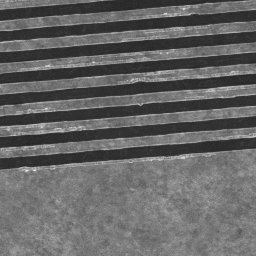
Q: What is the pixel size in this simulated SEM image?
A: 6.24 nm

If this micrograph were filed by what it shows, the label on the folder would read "parallel lines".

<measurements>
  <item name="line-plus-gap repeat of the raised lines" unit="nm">132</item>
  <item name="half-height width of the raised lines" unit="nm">59.8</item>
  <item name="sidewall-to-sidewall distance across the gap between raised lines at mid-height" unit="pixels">11.6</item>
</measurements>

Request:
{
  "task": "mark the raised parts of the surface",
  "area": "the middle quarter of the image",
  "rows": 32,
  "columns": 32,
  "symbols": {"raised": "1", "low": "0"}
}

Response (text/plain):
11111000000000000000000000000000
00000000000000000000000000000011
00000000000000000011111111111111
00000011111111111111111111111111
11111111111111111100000000000000
11111111000000000000000000000000
00000000000000000000000000000000
00000000000000000000001111111111
00000000011111111111111111111111
11111111111111111111110100000000
11111111111100000000000000000000
00000000000000000000000000000000
00000000000000000000000001111111
00000000000001111111111111111111
01111111111111111111111111110000
11111111111111110000000000000000
11110000000000000000000000000000
00000000000000000000000000000111
00000000000000000111111111111111
00000111111111111111111111111111
11111111111111111111000000000000
11111111000000000000000000000000
00000000000000000000000000000000
00000000000000000000011111111111
00000000011111111111111111111111
11111111111111111111111111111111
11111111111111111111111111111111
11111111111111111111111111111111
11111111111111111111111111111111
11111111111111111111111111111111
11111111111111111111111111111111
11111111111111111111111111111111